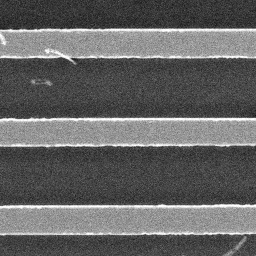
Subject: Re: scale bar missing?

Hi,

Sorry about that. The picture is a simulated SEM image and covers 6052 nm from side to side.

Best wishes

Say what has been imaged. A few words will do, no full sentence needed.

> lines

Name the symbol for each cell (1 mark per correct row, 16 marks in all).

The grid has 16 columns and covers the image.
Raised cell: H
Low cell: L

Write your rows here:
LLLLLLLLLLLLLLLL
LLLLLLLLLLLLLLLL
HHHHHHHHHHHHHHHH
HHHHHHHHHHHHHHHH
LLLLLLLLLLLLLLLL
LLLLLLLLLLLLLLLL
LLLLLLLLLLLLLLLL
HHHHHHHHHHHHHHHH
HHHHHHHHHHHHHHHH
LLLLLLLLLLLLLLLL
LLLLLLLLLLLLLLLL
LLLLLLLLLLLLLLLL
LLLLLLLLLLLLLLLL
HHHHHHHHHHHHHHHH
HHHHHHHHHHHHHHHH
LLLLLLLLLLLLLLLL